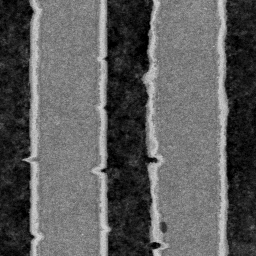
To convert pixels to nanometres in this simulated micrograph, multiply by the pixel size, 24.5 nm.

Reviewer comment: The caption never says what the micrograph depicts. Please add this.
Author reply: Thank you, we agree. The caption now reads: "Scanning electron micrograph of one or a few lines or trenches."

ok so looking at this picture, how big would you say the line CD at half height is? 1640 nm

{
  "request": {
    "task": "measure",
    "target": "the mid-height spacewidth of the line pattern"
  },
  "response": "1.29 µm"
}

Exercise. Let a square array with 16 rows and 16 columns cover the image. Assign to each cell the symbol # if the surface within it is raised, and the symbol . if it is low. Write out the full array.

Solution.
..####....####..
..####....####..
..####....####..
..####....####..
..####....####..
..####....####..
..####...#####..
..####...#####..
..####....####..
..####....####..
..####....####..
..####....####..
..####....####..
..####....####..
..####....####..
..####....####..